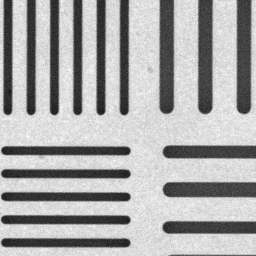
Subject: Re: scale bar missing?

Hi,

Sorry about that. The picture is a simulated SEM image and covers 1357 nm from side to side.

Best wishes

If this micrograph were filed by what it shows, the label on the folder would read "groups of lines, slits or small figures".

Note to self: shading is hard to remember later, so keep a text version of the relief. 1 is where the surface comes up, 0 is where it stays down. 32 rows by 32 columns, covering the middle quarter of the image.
11000111000111001111111100001111
11000111000111001111111100001111
11000111000111001111111100001111
11000111000111001111111100001111
11000111000111001111111100001111
11000111000111001111111100001111
11000111000111001111111100001111
11000111000111001111111100001111
11000111000111001111111100001111
11000111000111001111111100001111
11000111000111001111111100001111
11000111000111001111111100011111
11101111001111001111111110111111
11111111111111111111111111111111
11111111111111111111111111111111
11111111111111111111111111111111
11111111111111111111111111111111
11111111111111111111111111111111
11111111111111111111111111111111
11111111111111111111111111111111
00011111111111111111111111000000
00000000000000000111111110000000
00000000000000001111111110000000
11111111111111111111111110000000
11111111111111111111111111111111
11111111111111111111111111111111
00000000000000001111111111111111
00000000000000000111111111111111
00000000000000001111111111111111
11111111111111111111111111000000
11111111111111111111111110000000
11111111111111111111111110000000